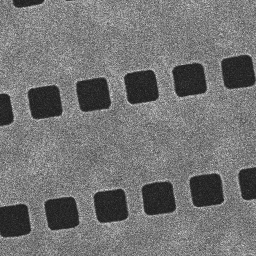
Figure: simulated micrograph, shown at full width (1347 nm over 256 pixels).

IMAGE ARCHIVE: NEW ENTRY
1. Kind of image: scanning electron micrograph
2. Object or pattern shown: a regular array of holes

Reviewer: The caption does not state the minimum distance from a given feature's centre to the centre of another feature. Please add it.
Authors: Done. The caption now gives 256 nm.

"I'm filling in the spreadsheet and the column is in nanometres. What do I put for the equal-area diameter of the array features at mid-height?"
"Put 184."